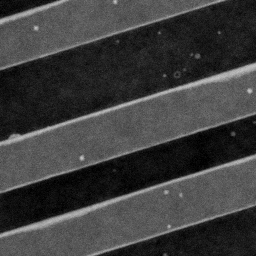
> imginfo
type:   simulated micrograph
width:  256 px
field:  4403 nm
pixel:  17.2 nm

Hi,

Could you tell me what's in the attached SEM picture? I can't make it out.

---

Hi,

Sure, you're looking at lines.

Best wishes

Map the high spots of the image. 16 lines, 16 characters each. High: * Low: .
..**********....
*********.......
******..........
***.............
..............**
...........*****
........********
....***********.
.***********....
********........
*****........***
**........******
.......*********
....**********..
***********.....
*******.........